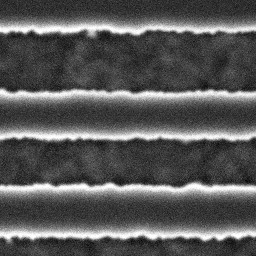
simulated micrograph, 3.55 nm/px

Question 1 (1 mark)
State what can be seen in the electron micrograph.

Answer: lines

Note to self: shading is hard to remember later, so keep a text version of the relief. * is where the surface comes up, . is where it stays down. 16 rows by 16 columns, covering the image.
****************
****************
................
................
................
................
****************
****************
****************
................
................
................
****************
****************
****************
................